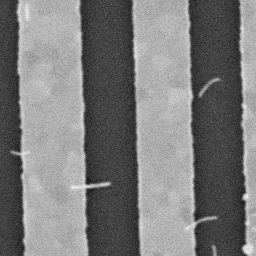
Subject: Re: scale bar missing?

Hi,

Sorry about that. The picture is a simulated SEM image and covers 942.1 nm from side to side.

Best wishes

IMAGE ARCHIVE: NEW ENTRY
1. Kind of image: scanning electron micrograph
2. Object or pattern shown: lines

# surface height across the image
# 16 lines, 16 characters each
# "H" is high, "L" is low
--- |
LHHHHLLLHHHHLLLH
LHHHHLLLHHHHLLLH
LHHHHLLLHHHHLLLH
LHHHHLLLHHHHLLLH
LHHHHLLLHHHHLLLH
LHHHHLLLHHHHLLLH
LHHHHLLLLHHHLLLH
LHHHHLLLLHHHLLLH
LHHHHLLLLHHHLLLH
LHHHHLLLLHHHLLLH
LHHHHLLLLHHHLLLH
LHHHHLLLLHHHLLLH
LHHHHLLLLHHHLLLH
LHHHHLLLLHHHLLLH
LLHHHLLLLHHHLLLH
LLHHHLLLLHHHLLLH